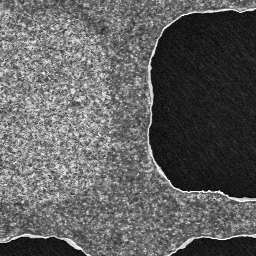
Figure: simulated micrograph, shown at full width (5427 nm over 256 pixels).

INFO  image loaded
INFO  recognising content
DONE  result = holes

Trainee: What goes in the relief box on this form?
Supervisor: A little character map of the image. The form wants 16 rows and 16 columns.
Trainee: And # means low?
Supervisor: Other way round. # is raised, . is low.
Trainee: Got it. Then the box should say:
################
###########.....
##########......
##########......
#########.......
##########......
##########......
#########.......
#########.......
#########.......
##########......
###########.....
################
################
################
.....######.....